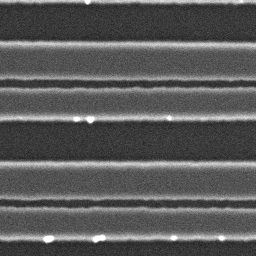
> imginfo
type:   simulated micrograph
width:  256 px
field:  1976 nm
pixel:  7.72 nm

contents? lines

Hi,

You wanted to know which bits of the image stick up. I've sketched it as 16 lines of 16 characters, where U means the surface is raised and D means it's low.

DDDDDDDDDDDDDDDD
DDDDDDDDDDDDDDDD
DDDDDDDDDDDDDDDD
UUUUUUUUUUUUUUUU
UUUUUUUUUUUUUUUU
UUUUUUUUUUUUUUUU
UUUUUUUUUUUUUUUU
DDDDDUDDDDDDDDDD
DDDDDDDDDDDDDDDD
DDDDDDDDDDDDDDDD
UUUUUUUUUUUUUUUU
UUUUUUUUUUUUUUUU
UUUUUUUUUUUUUUUU
UUUUUUUUUUUUUUUU
UUUUUUUUUUUUUUUU
DDDDDDDDDDDDDDDD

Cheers